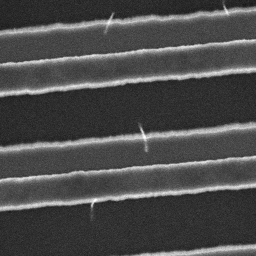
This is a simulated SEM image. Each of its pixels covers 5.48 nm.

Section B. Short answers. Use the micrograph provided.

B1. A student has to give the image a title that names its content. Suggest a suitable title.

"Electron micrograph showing lines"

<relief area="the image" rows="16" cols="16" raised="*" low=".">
................
......**********
****************
****************
**************..
****............
................
................
..........******
****************
****************
****************
******..........
................
................
...............*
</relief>